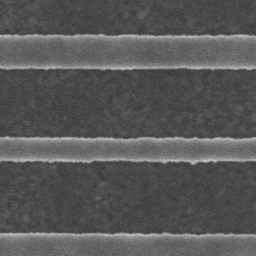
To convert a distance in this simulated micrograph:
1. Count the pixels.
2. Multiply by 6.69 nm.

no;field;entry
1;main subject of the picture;lines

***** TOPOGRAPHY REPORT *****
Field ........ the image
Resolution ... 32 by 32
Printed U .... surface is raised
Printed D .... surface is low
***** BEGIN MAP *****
DDDDDDDDDDDDDDDDDDDDDDDDDDDDDDDD
DDDDDDDDDDDDDDDDDDDDDDDDDDDDDDDD
DDDDDDDDDDDDDDDDDDDDDDDDDDDDDDDD
DDDDDDDDDDDDDDDDDDDDDDDDDDDDDDDD
UUUUUUUUUUUUUUUUUUUDDUUUUUDUUUUU
UUUUUUUUUUUUUUUUUUUUUUUUUUUUUUUU
UUUUUUUUUUUUUUUUUUUUUUUUUUUUUUUU
UUUUUUUUUUUUUUUUUUUUUUUUUUUUUUUU
UUUUUUUUUUUUUUUUUUUUUUUUUUUUUUUU
DDDDDDDDDDDDDDDDDDDDDDDDDDDDDDDD
DDDDDDDDDDDDDDDDDDDDDDDDDDDDDDDD
DDDDDDDDDDDDDDDDDDDDDDDDDDDDDDDD
DDDDDDDDDDDDDDDDDDDDDDDDDDDDDDDD
DDDDDDDDDDDDDDDDDDDDDDDDDDDDDDDD
DDDDDDDDDDDDDDDDDDDDDDDDDDDDDDDD
DDDDDDDDDDDDDDDDDDDDDDDDDDDDDDDD
DDDDDDDDDDDDDDDDDDDDDDDDDDDDDDDD
UUUUUUUUUUUUUUUUUUUUUUUUUUUUUUUU
UUUUUUUUUUUUUUUUUUUUUUUUUUUUUUUU
UUUUUUUUUUUUUUUUUUUUUUUUUUUUUUUU
DDDDDDDDDDDDDDDDDDDDDDDDDDDDDDDD
DDDDDDDDDDDDDDDDDDDDDDDDDDDDDDDD
DDDDDDDDDDDDDDDDDDDDDDDDDDDDDDDD
DDDDDDDDDDDDDDDDDDDDDDDDDDDDDDDD
DDDDDDDDDDDDDDDDDDDDDDDDDDDDDDDD
DDDDDDDDDDDDDDDDDDDDDDDDDDDDDDDD
DDDDDDDDDDDDDDDDDDDDDDDDDDDDDDDD
DDDDDDDDDDDDDDDDDDDDDDDDDDDDDDDD
DDDDDDDDDDDDDDDDDDDDDDDDDDDDDDDD
UUUUUUUUUUUUUUUUUUUUUUUUUUUUUUUU
UUUUUUUUUUUUUUUUUUUUUUUUUUUUUUUU
UUUUUUUUUUUUUUUUUUUUUUUUUUUUUUUU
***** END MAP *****